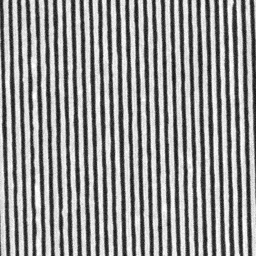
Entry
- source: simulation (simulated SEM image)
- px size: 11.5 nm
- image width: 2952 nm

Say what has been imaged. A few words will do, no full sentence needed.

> parallel lines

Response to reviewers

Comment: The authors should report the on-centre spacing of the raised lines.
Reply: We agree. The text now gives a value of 103 nanometres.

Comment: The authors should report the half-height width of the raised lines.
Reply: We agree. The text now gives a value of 46.1 nm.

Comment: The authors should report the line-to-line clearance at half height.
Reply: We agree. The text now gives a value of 0.0576 µm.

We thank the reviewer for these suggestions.